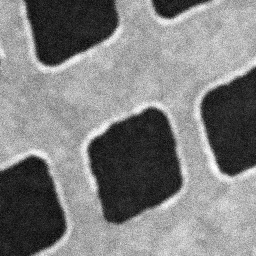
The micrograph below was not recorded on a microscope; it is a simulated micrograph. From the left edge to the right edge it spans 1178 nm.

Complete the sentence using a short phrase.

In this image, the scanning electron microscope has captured holes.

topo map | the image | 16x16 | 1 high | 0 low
1000000111001111
1100000111111111
1100000111111111
1100011111111111
1111111111111110
1111111111111000
1111111111111000
1111111000011000
1111110000011000
1111100000011000
0001110000011100
0001110000011111
0000110000011111
0000110001111111
0000111111111111
0001111111111111